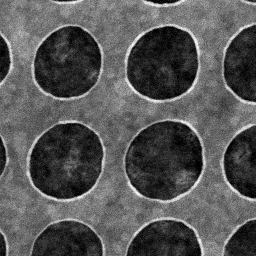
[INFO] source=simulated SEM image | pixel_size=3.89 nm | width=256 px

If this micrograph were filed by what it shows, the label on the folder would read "holes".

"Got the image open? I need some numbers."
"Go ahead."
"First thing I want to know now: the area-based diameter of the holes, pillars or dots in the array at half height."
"291 nm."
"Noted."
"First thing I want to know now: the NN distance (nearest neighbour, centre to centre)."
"374 nm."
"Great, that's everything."